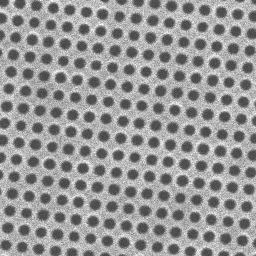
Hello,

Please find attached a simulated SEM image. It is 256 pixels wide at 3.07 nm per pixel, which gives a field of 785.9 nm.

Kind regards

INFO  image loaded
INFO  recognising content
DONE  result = a regular array of holes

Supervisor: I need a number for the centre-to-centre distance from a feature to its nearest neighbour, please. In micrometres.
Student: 0.051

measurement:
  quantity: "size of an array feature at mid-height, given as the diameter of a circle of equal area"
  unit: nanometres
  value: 33.3